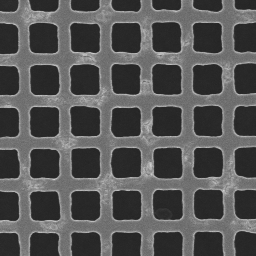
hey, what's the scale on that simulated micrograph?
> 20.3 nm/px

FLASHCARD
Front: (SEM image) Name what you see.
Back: a regular array of holes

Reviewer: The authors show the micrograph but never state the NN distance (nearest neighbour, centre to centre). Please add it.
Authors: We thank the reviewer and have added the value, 822 nm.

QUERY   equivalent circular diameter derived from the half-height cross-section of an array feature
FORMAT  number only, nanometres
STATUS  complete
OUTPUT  661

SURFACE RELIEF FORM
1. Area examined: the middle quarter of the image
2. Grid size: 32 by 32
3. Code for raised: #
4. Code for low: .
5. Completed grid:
##......####.......####......###
##.......###.......###.......###
#........###.......###.......###
##.......###.......###.......###
##.......###.......###.......###
##.......###.......###.......###
##.......###.......###........##
##......#####......####......###
################################
################################
##########################.#####
##.......###.......###.......###
##.......###.......###........##
##.......###.......###........##
##.......###.......###........##
##.......###.......###........##
##.......###.......###.......###
##.......###.......###.......###
################################
################################
################################
##.......####......####......###
##.......###.......###........##
##.......###.......###........##
##.......###.......###........##
##.......###.......###........##
##.......###.......###........##
##.......###.......####.......##
###.##..#####..#########.....###
################################
################################
############################.###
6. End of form